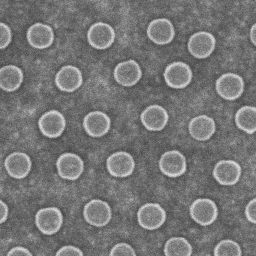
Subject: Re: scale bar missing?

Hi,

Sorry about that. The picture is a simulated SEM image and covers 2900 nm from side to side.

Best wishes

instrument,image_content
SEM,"a regular array of raised bodies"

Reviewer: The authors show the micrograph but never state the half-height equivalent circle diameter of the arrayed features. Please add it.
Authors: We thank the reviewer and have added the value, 0.28 µm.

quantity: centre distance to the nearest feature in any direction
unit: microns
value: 0.522